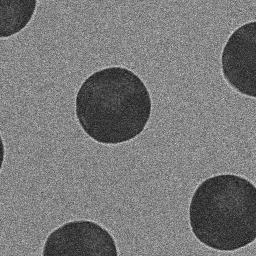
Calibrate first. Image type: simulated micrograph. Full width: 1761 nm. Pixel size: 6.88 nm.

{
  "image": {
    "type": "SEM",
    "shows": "holes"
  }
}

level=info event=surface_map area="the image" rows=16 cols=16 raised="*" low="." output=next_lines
..**************
..*************.
**************..
**************..
******..******..
*****....******.
*****....*******
*****....*******
******..********
****************
****************
*************...
************....
************....
***....*****....
***....******..*